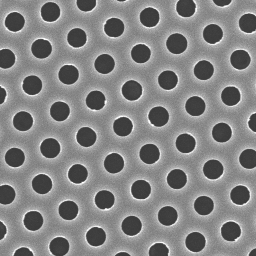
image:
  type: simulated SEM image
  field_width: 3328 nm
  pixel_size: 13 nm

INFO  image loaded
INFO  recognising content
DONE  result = a regular array of holes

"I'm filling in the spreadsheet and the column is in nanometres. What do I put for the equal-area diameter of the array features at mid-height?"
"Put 263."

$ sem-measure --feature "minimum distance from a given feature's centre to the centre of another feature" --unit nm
482